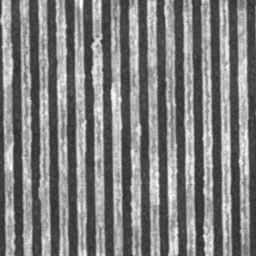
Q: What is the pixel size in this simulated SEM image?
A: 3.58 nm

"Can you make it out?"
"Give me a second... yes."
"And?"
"parallel lines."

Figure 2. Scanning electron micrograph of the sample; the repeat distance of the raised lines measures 0.0648 µm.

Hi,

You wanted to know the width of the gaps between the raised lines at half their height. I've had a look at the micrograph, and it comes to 0.0345 micrometres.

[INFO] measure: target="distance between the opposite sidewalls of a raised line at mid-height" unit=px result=8.63